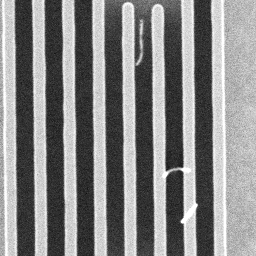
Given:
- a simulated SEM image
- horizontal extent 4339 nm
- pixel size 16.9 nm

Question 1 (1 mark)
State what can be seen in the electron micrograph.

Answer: groups of lines, slits or small figures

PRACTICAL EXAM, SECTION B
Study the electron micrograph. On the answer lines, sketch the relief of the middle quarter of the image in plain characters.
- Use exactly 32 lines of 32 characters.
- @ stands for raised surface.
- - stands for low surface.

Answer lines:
@@------@@-----@@-----@@@-----@@
@@------@@-----@@-----@@@-----@@
@@------@@-----@@-----@@@-----@@
@@------@@-----@@-----@@@-----@@
@@------@@-----@@@----@@@-----@@
@@-----@@@-----@@@----@@@-----@@
@@-----@@@-----@@@----@@@-----@@
@@------@@-----@@@----@@@-----@@
@@------@@-----@@@----@@@-----@@
@@------@@-----@@@----@@@-----@@
@@------@@-----@@@----@@@-----@@
@@------@@-----@@@----@@@-----@@
@@@-----@@-----@@@----@@@-----@@
@@@-----@@-----@@@----@@@-----@@
@@@-----@@-----@@@----@@@-----@@
@@@-----@@-----@@@----@@@-----@@
@@@-----@@-----@@@----@@@-----@@
@@@-----@@-----@@@----@@@-----@@
@@@-----@@-----@@@----@@@-----@@
@@@-----@@-----@@@----@@@-----@@
@@@-----@@-----@@@-----@@-----@@
@@@-----@@-----@@@-----@@-----@@
@@@-----@@-----@@@-----@@-----@@
@@@-----@@-----@@@-----@@-----@@
@@@-----@@-----@@@-----@@-----@@
@@@-----@@-----@@@-----@@-----@@
@@@-----@@-----@@@-----@@-----@@
@@@-----@@-----@@@-----@@@----@@
@@@-----@@-----@@@-----@@-----@@
@@@-----@@-----@@@-----@@-----@@
@@@-----@@-----@@@-----@@-----@@
@@@-----@@-----@@@-----@@-----@@